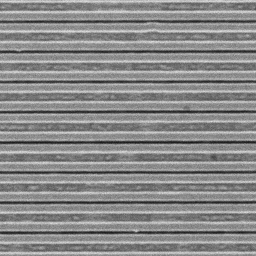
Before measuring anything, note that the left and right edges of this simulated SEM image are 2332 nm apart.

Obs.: parallel lines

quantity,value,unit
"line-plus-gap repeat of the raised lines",135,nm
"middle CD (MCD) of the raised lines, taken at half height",0.0774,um